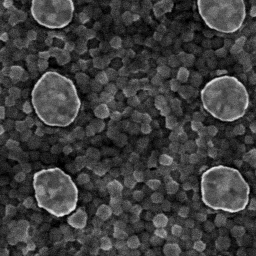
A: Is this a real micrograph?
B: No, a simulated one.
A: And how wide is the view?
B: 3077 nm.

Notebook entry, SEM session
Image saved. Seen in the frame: raised bodies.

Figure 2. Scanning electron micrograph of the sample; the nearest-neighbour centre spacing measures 1100 nanometres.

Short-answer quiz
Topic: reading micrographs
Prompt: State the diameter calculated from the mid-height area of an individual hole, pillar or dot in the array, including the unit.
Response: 551 nm